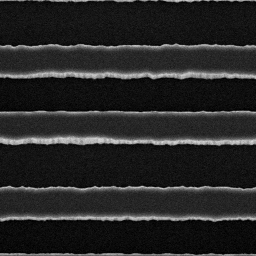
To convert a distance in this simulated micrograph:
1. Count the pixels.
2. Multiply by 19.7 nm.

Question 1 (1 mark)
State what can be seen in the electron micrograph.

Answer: lines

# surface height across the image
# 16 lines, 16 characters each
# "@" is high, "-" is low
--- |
----------------
----------------
----------------
@@@@@@@@@@@@@@@@
@@@@@@@@@@@@@@@@
----------------
----------------
@@@@@@@@@@@@@@@@
@@@@@@@@@@@@@@@@
----------------
----------------
----------------
@@@@@@@@@@@@@@@@
@@@@@@@@@@@@@@@@
----------------
----------------